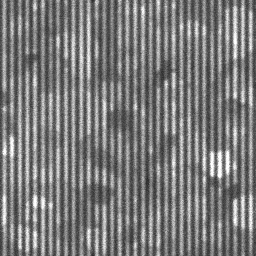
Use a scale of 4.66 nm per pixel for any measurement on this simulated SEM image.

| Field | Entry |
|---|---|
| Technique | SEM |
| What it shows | parallel lines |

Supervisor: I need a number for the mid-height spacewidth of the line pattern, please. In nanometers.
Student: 25.7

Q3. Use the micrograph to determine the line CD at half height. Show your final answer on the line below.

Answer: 2.51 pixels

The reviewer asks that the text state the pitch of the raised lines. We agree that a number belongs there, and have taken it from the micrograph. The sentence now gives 0.0359 micrometres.